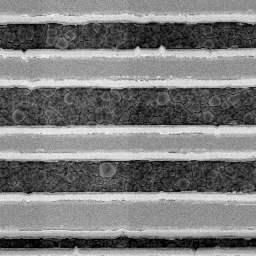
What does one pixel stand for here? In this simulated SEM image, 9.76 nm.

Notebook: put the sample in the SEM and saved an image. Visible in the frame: one or a few lines or trenches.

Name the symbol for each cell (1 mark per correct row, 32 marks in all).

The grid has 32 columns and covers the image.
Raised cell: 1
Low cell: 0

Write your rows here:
11111111111111111111111111111111
11111111111111111111111111111111
00000000000000000000000000000000
00000000000000000000000000000000
00000000000000000000000000000000
00000000000000000000000000000000
00000000000000000100100000000000
11111111111111111111111111111111
11111111111111111111111111111111
11111111111111111111111111111111
00001000000000000000000000000000
00000000000000000000000000000000
00000000000000000000000000000000
00000000000000000000000000000000
00000000000000000000000000000000
00000000000000000000000000000000
11111111111111111111111111111111
11111111111111111111111111111111
11111111111111111111111111111111
00000000000000010100000111000000
00000000000000000000000000000000
00000000000000000000000000000000
00000000000000000000000000000000
00000000000000000000000000000000
00000000000000000000000000000000
11111111111111111111111111111111
11111111111111111111111111111111
11111111111111111111111111111111
11111111111111111111111111111111
00000000000000000000000000000000
00000000000000000000000000000000
00000000000000000000000000010000